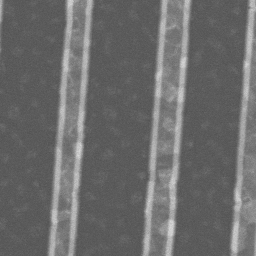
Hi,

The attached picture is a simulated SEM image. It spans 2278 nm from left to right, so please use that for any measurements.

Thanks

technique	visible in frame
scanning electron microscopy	one or a few lines or trenches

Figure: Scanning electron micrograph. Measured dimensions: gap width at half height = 619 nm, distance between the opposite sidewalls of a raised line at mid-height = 188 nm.